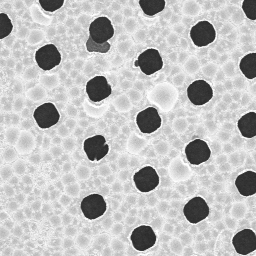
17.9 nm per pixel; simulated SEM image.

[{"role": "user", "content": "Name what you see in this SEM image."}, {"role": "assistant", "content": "a regular array of holes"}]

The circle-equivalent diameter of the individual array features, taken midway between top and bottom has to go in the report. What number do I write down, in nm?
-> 457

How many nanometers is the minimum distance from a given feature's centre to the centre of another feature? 1040